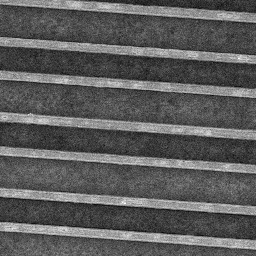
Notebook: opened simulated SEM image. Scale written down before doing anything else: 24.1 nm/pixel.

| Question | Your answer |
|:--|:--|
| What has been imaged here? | parallel lines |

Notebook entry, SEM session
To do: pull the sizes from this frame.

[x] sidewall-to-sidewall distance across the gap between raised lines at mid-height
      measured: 0.723 micrometres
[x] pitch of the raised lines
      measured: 902 nm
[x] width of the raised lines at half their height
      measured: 0.186 µm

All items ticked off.